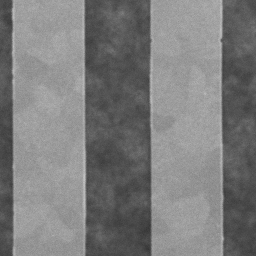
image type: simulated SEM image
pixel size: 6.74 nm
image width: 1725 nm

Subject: one or a few lines or trenches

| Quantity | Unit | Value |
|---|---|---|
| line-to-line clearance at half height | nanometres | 449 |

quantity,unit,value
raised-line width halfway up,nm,480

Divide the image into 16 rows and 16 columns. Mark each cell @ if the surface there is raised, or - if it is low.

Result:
-@@@@----@@@@@--
-@@@@----@@@@@--
-@@@@----@@@@@--
-@@@@----@@@@@--
-@@@@----@@@@@--
-@@@@----@@@@@--
-@@@@----@@@@@--
-@@@@----@@@@@--
-@@@@----@@@@@--
-@@@@----@@@@@--
-@@@@----@@@@@--
-@@@@----@@@@@--
-@@@@----@@@@@--
-@@@@-----@@@@--
-@@@@-----@@@@--
-@@@@-----@@@@--